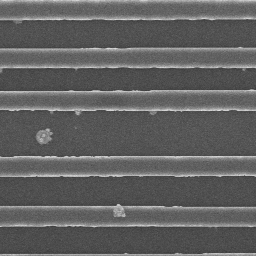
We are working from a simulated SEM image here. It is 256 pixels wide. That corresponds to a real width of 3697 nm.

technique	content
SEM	lines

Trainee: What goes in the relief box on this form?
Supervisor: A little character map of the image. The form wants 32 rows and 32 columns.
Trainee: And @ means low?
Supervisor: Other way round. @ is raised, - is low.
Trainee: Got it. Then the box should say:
@@@@@@@@@@@@@@@@@@@@@@@@@@@@@@@@
@@@@@@@@@@@@@@@@@@@@@@@@@@@@@@@@
--------------------------------
--------------------------------
--------------------------------
--------------------------------
@@@@@@@@@@@@@@@@@@@@@@@@@@@@@@@@
@@@@@@@@@@@@@@@@@@@@@@@@@@@@@@@@
--------------------------------
--------------------------------
--------------------------------
@@@@@@@@@@@@@@@@@@@@@@@@@@@@@@@@
@@@@@@@@@@@@@@@@@@@@@@@@@@@@@@@@
@@@@@@@@@@@@@@@@@@@@@@@@@@@@@@@@
--------------------------------
--------------------------------
--------------------------------
--------------------------------
--------------------------------
--------------------------------
@@@@@@@@@@@@@@@@@@@@@@@@@@@@@@@@
@@@@@@@@@@@@@@@@@@@@@@@@@@@@@@@@
--------------------------------
--------------------------------
--------------------------------
--------------------------------
@@@@@@@@@@@@@@@@@@@@@@@@@@@@@@@@
@@@@@@@@@@@@@@@@@@@@@@@@@@@@@@@@
--------------------------------
--------------------------------
--------------------------------
--------------------------------